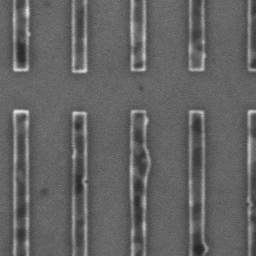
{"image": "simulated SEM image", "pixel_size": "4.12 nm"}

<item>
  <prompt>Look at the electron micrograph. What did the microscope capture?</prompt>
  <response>parallel lines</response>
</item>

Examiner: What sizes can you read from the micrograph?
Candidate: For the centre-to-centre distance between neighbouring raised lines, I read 242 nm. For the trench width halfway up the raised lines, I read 0.186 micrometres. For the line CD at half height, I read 55.7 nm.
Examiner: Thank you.